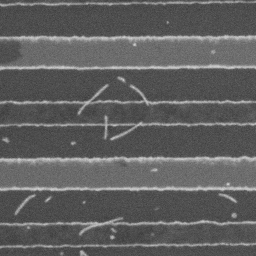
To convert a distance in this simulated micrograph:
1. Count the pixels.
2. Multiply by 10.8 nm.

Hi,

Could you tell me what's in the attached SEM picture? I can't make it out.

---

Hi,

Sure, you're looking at lines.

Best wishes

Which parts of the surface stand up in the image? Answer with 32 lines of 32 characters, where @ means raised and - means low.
@@@@@@@@@----@------------------
--------------------------------
--------------------------------
--------------------------------
--------------------------------
@@@@@@@@@@@@@@@@@@@@@@@@@@@@@@@@
@@@@@@@@@@@@@@@@@@@@@@@@@@@@@@@@
@@@@@@@@@@@@@@@@@@@@@@@@@@@@@@@@
@@@@@@@@@@@@@@@@@@@-@@------@---
--------------------------------
--------------------------------
--------------------------------
--------------------------------
@@@@@@@@@@@@@@@@@@@@@@@@@@@@@@@@
@@@@@@@@@@@@@@@@@@@@@@@@@@@@@@@@
@@@@@@@@@@@@@@@@@@@@@@@@@@@@@@@@
--------------------------------
--------------------------------
--------------------------------
--------------------------------
@@@@@@@@@@@@@@@@@@@@@@@@@@@@@@@@
@@@@@@@@@@@@@@@@@@@@@@@@@@@@@@@@
@@@@@@@@@@@@@@@@@@@@@@@@@@@@@@@@
@@@@@@@@@@@@@@@@@@@@@@@@@@@@@@@@
--------------------------------
--------------------------------
--------------------------------
--------------------------------
@@@@@@@@@@@@@@@@@@@@@@@@@@@@@@@@
@@@@@@@@@@@@@@@@@@@@@@@@@@@@@@@@
@@@@@@@@@@@@@@@@@@@@@@@@@@@@@@@@
--------------------------------